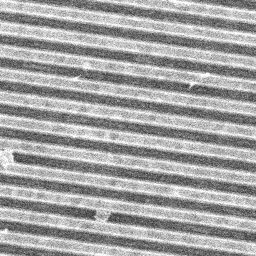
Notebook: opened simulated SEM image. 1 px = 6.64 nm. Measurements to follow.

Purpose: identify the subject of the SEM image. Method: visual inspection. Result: parallel lines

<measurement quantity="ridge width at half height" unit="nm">79.7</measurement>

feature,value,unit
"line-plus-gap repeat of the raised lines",0.152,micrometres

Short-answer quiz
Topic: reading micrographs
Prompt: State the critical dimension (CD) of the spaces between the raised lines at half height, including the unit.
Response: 74 nm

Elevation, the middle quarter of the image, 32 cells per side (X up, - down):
-XXXXXXXXXXXXXXXXXXXXX----------
--------XXXXXXXXXXXXXXXXXXXX----
----------------XXXXXXXXXXXXXXXX
XXXX-------------------XXXXXXXXX
XXXXXXXXX---------------------XX
XXXXXXXXXXXXXXXX----------------
--XXXXXXXXXXXXXXXXXXXXX---------
---------XXXXXXXXXXXXXXXXXXXXX--
-----------------XXXXXXXXXXXXXXX
XXX---------------------XXXXXXXX
XXXXXXXXXX---------------------X
XXXXXXXXXXXXXXXXX---------------
---XXXXXXXXXXXXXXXXXXXXX--------
----------XXXXXXXXXXXXXXXXXXXXX-
-------------------XXXXXXXXXXXXX
XXX----------------------XXXXXXX
XXXXXXXXXXX---------------------
XXXXXXXXXXXXXXXXXX--------------
----XXXXXXXXXXXXXXXXXXXXX-------
------------XXXXXXXXXXXXXXXXXXXX
-------------------XXXXXXXXXXXXX
XXXXX---------------------XXXXXX
XXXXXXXXXXXX--------------------
XXXXXXXXXXXXXXXXXXX-------------
------XXXXXXXXXXXXXXXXXXXX------
--------------XXXXXXXXXXXXXXXXXX
---------------------XXXXXXXXXXX
XXXXXX----------------------XXXX
XXXXXXXXXXXXX-------------------
-XXXXXXXXXXXXXXXXXXX------------
--------XXXXXXXXXXXXXXXXXXX-----
---------------XXXXXXXXXXXXXXXXX